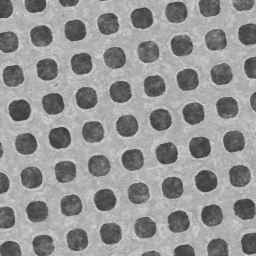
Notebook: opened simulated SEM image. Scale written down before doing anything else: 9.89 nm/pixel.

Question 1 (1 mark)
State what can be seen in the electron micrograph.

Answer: a regular array of holes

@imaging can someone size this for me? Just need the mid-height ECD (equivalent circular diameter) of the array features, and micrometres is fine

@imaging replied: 0.225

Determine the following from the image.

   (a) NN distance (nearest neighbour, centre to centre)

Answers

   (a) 0.336 um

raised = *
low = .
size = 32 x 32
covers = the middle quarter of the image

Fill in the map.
**.....****....*****************
**.....***********************..
***...**********************....
********************.....***....
*************...****.....***....
************.....***.....****...
****....***......***.....****...
***.....***......***.....*******
***.....****.....***************
***.....*****..*****************
***.....**********************..
***********************...****..
**********************.....***..
**************....***......***..
******...****.....***......***..
*****.....***......***.....*****
.***......***.....*****..*******
..**......****....**************
..***.....**********************
..****...**********************.
.**********************.....***.
****************...****.....***.
***************.....***......***
*******....***......***.....****
..****.....***......****....****
...***......***.....************
...***......****...*************
...****....*********************
...***********************...***
..***********************.....**
*****************....***......**
*********...****.....****.....**